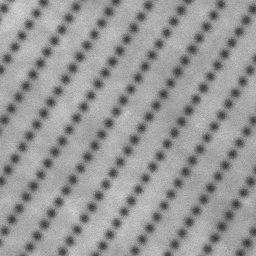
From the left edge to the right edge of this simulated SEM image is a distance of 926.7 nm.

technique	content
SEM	a regular array of holes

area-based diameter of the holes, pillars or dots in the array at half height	29.1	nm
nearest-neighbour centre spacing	13.3	pixels